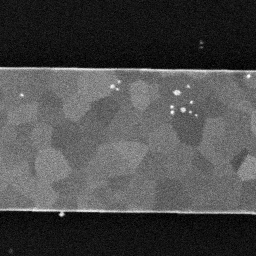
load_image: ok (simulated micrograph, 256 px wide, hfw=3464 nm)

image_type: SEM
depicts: wiring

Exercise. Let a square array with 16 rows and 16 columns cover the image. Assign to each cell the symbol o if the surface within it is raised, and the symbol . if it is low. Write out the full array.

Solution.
................
................
................
................
oooooooooooooooo
oooooooooooooooo
oooooooooooooooo
oooooooooooooooo
oooooooooooooooo
oooooooooooooooo
oooooooooooooooo
oooooooooooooooo
oooooooooooooooo
................
................
................